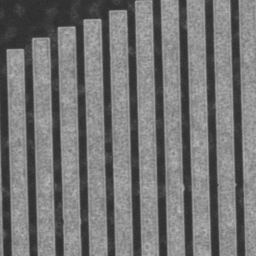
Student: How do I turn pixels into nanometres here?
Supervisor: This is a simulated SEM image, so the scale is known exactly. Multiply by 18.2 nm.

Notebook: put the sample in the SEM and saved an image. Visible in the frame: parallel lines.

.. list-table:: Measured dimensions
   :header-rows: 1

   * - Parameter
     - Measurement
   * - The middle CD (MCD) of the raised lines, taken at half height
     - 296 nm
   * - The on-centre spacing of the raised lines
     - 473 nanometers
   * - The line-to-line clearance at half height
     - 176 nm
